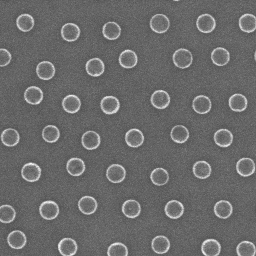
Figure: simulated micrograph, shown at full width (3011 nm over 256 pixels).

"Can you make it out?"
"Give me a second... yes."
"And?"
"a regular array of raised bodies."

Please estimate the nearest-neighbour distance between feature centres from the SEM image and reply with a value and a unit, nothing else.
436 nanometres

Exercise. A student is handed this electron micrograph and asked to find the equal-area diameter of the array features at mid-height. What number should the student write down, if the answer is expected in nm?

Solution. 210